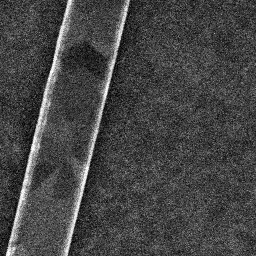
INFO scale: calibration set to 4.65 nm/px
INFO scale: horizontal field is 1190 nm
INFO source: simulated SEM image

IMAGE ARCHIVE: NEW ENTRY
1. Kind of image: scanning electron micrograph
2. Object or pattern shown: one or a few lines or trenches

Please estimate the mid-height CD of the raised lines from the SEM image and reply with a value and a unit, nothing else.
273 nm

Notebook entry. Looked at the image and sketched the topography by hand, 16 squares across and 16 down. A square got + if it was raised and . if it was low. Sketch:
....++++........
....++++........
....+++.........
...++++.........
...++++.........
...++++.........
...++++.........
..++++..........
..++++..........
..++++..........
..++++..........
.++++...........
.++++...........
.++++...........
.++++...........
.+++............